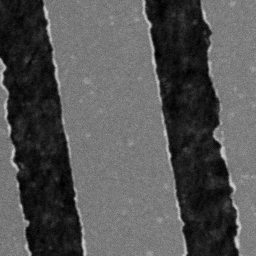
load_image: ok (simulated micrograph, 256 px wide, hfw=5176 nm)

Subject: one or a few lines or trenches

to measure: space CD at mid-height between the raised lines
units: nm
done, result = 1120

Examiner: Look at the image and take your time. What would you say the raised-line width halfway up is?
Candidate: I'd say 1990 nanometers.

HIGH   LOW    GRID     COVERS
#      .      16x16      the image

...######....###
...######....###
...######....###
...#######...###
....######...###
....######...###
....######....##
....######....##
#...######...###
#...#######...##
#...#######...##
#....######...##
#....######....#
#....######....#
##...######....#
##...#######...#